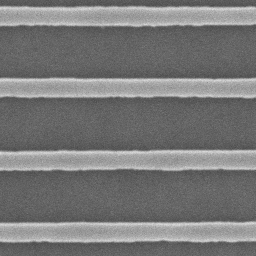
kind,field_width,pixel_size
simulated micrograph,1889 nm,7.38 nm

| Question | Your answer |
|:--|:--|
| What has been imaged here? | lines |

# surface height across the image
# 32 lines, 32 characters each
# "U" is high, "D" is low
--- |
DDDDDDDDDDDDDDDDDDDDDDDDDDDDDDDD
UUUUUUUUUUUUUUUUUUUUUUUUUUUUUUUU
UUUUUUUUUUUUUUUUUUUUUUUUUUUUUUUU
DDDDDDDDDDDDDDDDDDDDDDDDDDDDDDDD
DDDDDDDDDDDDDDDDDDDDDDDDDDDDDDDD
DDDDDDDDDDDDDDDDDDDDDDDDDDDDDDDD
DDDDDDDDDDDDDDDDDDDDDDDDDDDDDDDD
DDDDDDDDDDDDDDDDDDDDDDDDDDDDDDDD
DDDDDDDDDDDDDDDDDDDDDDDDDDDDDDDD
DDDDDDDDDDDDDDDDDDDDDDDDDDDDDDDD
UUUUUUUUUUUUUUUUUUUUUUUUUUUUUUUU
UUUUUUUUUUUUUUUUUUUUUUUUUUUUUUUU
DDDDDDDDDDDDDDDDDDDDDDDDDDDDDDDD
DDDDDDDDDDDDDDDDDDDDDDDDDDDDDDDD
DDDDDDDDDDDDDDDDDDDDDDDDDDDDDDDD
DDDDDDDDDDDDDDDDDDDDDDDDDDDDDDDD
DDDDDDDDDDDDDDDDDDDDDDDDDDDDDDDD
DDDDDDDDDDDDDDDDDDDDDDDDDDDDDDDD
DDDDDDDDDDDDDDDDDDDDDDDDDDDDDDDD
UUUUUUUUUUUUUUUUUUUUUUUUUUUUUUUU
UUUUUUUUUUUUUUUUUUUUUUUUUUUUUUUU
DDDDDDDDDDDDDDDDDDDDDDDDDDDDDDDD
DDDDDDDDDDDDDDDDDDDDDDDDDDDDDDDD
DDDDDDDDDDDDDDDDDDDDDDDDDDDDDDDD
DDDDDDDDDDDDDDDDDDDDDDDDDDDDDDDD
DDDDDDDDDDDDDDDDDDDDDDDDDDDDDDDD
DDDDDDDDDDDDDDDDDDDDDDDDDDDDDDDD
DDDDDDDDDDDDDDDDDDDDDDDDDDDDDDDD
UUUUUUUUUUUUUUUUUUUUUUUUUUUUUUUU
UUUUUUUUUUUUUUUUUUUUUUUUUUUUUUUU
DDDDDDDDDDDDDDDDDDDDDDDDDDDDDDDD
DDDDDDDDDDDDDDDDDDDDDDDDDDDDDDDD